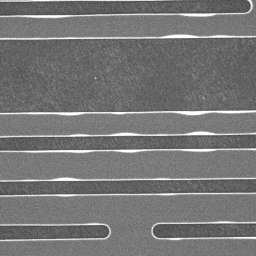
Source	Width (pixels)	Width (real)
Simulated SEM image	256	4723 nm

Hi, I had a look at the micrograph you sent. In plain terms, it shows groups of lines, slits or small figures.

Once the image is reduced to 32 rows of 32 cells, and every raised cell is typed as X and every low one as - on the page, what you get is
-------------------------------X
-------------------------------X
XXXXXXXXXXXXXXXXXXXXXXXXXXXXXXXX
XXXXXXXXXXXXXXXXXXXXXXXXXXXXXXXX
XXXXXXXXXXXXXXXXXXXXXX-XXXXXXXXX
--------------------------------
--------------------------------
--------------------------------
--------------------------------
--------------------------------
--------------------------------
--------------------------------
--------------------------------
--------------------------------
XXXXXXXXXXXXXXXXXXXXXXXXXXXXXXXX
XXXXXXXXXXXXXXXXXXXXXXXXXXXXXXXX
XXXXXXXXXXXXXXXXXXXXXXXXXXXXXXXX
--------------------------------
--------------------------------
XXXXXXXXXXXXXXXXXXXXXXXXXXXXXXXX
XXXXXXXXXXXXXXXXXXXXXXXXXXXXXXXX
XXXXXXXXXXXXXXXXXXXXXXXXXXXXXXXX
XXXXXXX--XXXXXX-----------------
--------------------------------
---XXXXXXXXXXXXXXXXXXXXXXXXXXXXX
XXXXXXXXXXXXXXXXXXXXXXXXXXXXXXXX
XXXXXXXXXXXXXXXXXXXXXXXXXXXXXXXX
XXXXXXXXXXXXXXXXXXXXXXXXXXXXXXXX
--------------XXXXX-------------
-------------XXXXXX-------------
XXXXXXXXXXXXXXXXXXXXXXXXXXXXXXXX
XXXXXXXXXXXXXXXXXXXXXXXXXXXXXXXX